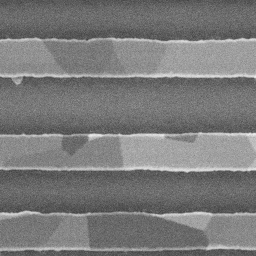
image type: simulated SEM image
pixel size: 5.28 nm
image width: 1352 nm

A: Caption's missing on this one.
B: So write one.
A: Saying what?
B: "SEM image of lines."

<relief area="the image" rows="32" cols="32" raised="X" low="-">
--------------------------------
--------------------------------
--------------------------------
--------------------------------
--------------------------------
XXXXXXXXXXXXXXXXXXXXXXXXXXXXXXXX
XXXXXXXXXXXXXXXXXXXXXXXXXXXXXXXX
XXXXXXXXXXXXXXXXXXXXXXXXXXXXXXXX
XXXXXXXXXXXXXXXXXXXXXXXXXXXXXXXX
XX--X-XXXX-XXXXXXXXX---XXXXXXX-X
--------------------------------
--------------------------------
--------------------------------
--------------------------------
--------------------------------
--------------------------------
--------------------------------
XXXXXXXXXXXXXXXXXXXXXXXXXXXXXXXX
XXXXXXXXXXXXXXXXXXXXXXXXXXXXXXXX
XXXXXXXXXXXXXXXXXXXXXXXXXXXXXXXX
XXXXXXXXXXXXXXXXXXXXXXXXXXXXXXXX
--------------------------------
--------------------------------
--------------------------------
--------------------------------
--------------------------------
---X----------------------------
XXXXXXXXXXXXXXXXXXXXXXXXXXXXXXXX
XXXXXXXXXXXXXXXXXXXXXXXXXXXXXXXX
XXXXXXXXXXXXXXXXXXXXXXXXXXXXXXXX
XXXXXXXXXXXXXXXXXXXXXXXXXXXXXXXX
--------------------------------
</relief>